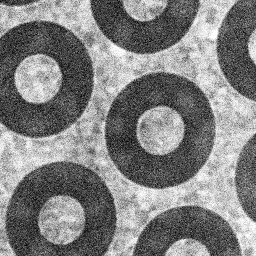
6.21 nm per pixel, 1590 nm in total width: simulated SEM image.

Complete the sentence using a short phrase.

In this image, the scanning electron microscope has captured ring-shaped grooves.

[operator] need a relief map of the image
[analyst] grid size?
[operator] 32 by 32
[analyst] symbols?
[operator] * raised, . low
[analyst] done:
....*******....******....****...
***********.....****.....***....
****.*******............****....
*.......****............***.....
..........***..........****....*
...........***........*****....*
...........*****....*******....*
...****.....***************.....
..*****.....***************.....
..******....*****......*****....
..******....****.........****...
..*****.....***...........****..
...***.....***............*****.
...........***......*......*****
..........***.....****.....*****
.........****....******....*****
*.......*****....******....*****
*************....******....****.
*************.....****.....***..
**************............****..
*****.....****............***...
****........***..........****...
***..........***........*****...
**............****...********...
*.............***************...
*.....****....****************..
*....*****.....*****.......***..
*....*****.....****.........***.
*....*****.....***...........***
*.....****....***.............**
*.............***.....***.....**
**...........****....*****....**